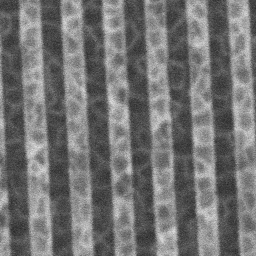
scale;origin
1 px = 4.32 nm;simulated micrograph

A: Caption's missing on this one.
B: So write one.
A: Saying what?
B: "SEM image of parallel lines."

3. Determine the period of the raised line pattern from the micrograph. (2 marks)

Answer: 180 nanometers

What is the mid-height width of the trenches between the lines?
100 nm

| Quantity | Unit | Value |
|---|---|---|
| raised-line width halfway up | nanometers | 81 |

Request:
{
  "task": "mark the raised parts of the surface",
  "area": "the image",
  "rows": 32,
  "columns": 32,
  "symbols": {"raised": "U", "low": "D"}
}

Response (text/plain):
DDDUUDDDUUDDDUUDDDUUUDDUUUDDDUUD
DDDUUDDDUUDDDUUDDDUUDDDUUUDDDUUD
DDDUUDDDUUDDDUUDDDUUUDDDUUDDDUUD
DDDUUDDDUUDDDUUDDDUUUDDDUUDDDUUD
DDDUUDDDUUDDDUUDDDUUUDDDUUDDDUUD
DDDUUDDDUUDDDUUUDDUUUDDDUUDDDUUD
DDDUUDDDUUDDDUUUDDUUUDDDUUDDDUUD
DDDUUDDDUUDDDUUUDDDUUDDDUUDDDUUD
DDDUUDDDUUDDDUUUDDDUUDDDUUDDDUUD
DDDUUDDDUUDDDUUUDDDUUDDDUUDDDUUD
DDDUUDDDUUUDDDUUDDDUUDDDUUDDDUUD
DDDUUDDDUUUDDDUUDDDUUDDDUUDDDUUD
DDDUUDDDUUUDDDUUDDDUUDDDUUDDDUUD
DDDUUUDDUUUDDDUUDDDUUDDDUUDDDUUU
DDDUUUDDUUUDDDUUDDDUUDDDUUDDDUUU
DDDUUUDDUUUDDDUUDDDUUDDDUUDDDUUU
DDDUUUDDDUUDDDUUDDDUUDDDUUUDDUUU
DDDUUUDDDUUDDDUUDDDUUDDDUUUDDDUU
DDDUUUDDDUUDDDUUDDDUUDDDUUUDDDUU
UDDDUUDDDUUDDDUUDDDUUDDDUUUDDDUU
UDDDUUDDDUUDDDUUDDDUUDDDUUUDDDUU
UDDDUUDDDUUDDDUUDDDUUDDDUUUDDDUU
UDDDUUDDDUUDDDUUDDDUUUDDDUUDDDUU
UDDDUUDDDUUDDDUUDDDUUUDDDUUDDDUU
UDDDUUDDDUUDDDUUDDDUUUDDDUUDDDUU
UDDDUUDDDUUDDDUUUDDUUUDDDUUDDDUU
UDDDUUDDDUUDDDUUUDDUUUDDDUUDDDUU
UDDDUUDDDUUDDDUUUDDDUUDDDUUDDDUU
UDDDUUDDDUUDDDUUUDDDUUDDDUUDDDUU
UDDDUUDDDUUDDDUUUDDDUUDDDUUDDDUU
UDDDUUDDDUUUDDDUUDDDUUDDDUUDDDUU
UDDDUUDDDUUUDDDUUDDDUUDDDUUDDDUU